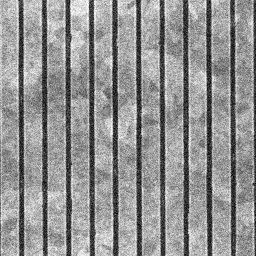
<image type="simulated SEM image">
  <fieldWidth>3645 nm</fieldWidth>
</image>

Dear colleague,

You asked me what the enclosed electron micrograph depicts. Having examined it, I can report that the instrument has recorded parallel lines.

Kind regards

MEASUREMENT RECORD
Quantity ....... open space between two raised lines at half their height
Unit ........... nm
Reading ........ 99.7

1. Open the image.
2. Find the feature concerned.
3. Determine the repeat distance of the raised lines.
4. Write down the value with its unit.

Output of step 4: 335 nm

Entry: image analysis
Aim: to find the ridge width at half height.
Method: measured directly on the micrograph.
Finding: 239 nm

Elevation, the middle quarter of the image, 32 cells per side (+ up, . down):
..++++..++++..++++..+++...+++..+
..++++..++++..++++..+++...+++..+
..++++..++++..++++..+++...+++..+
..++++..++++..++++..++++..+++..+
..++++..++++..++++..++++..+++..+
..++++..++++..++++..++++..+++..+
..++++..++++..++++..++++..+++..+
..++++..++++..++++..++++..+++..+
..++++..++++..++++..++++..+++..+
..++++..++++..++++..++++..+++..+
..++++..++++..++++..++++..+++..+
..++++..++++..++++..++++..+++...
..++++..++++..++++..++++..+++...
..++++..++++..++++..++++..+++...
..++++..++++..++++..++++..+++...
..++++..++++..++++..++++..++++..
..++++..++++..++++..++++..++++..
..++++..++++..++++..++++..++++..
..++++..++++..++++..++++..++++..
..++++..++++..++++..++++..++++..
..++++..++++..++++..++++..++++..
..++++..++++..++++..++++..++++..
..++++..++++..++++..++++..++++..
..++++..++++..++++..++++..++++..
..++++..++++..++++..++++..++++..
..++++..++++..++++..++++..++++..
..++++..++++..++++..++++..++++..
..++++..++++..++++..++++..++++..
..++++..++++..++++..++++..++++..
..++++..++++..++++..++++..++++..
..++++..++++..++++..++++..++++..
..++++..++++..++++..++++..++++..